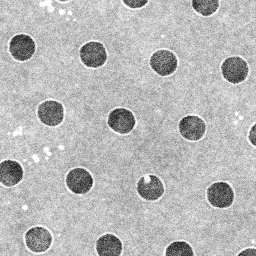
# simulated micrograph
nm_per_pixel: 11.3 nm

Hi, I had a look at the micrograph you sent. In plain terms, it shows a regular array of holes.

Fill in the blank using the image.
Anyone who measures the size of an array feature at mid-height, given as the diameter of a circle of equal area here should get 312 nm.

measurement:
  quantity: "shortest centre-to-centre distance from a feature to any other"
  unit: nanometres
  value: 801